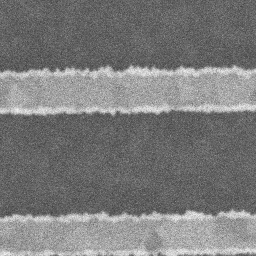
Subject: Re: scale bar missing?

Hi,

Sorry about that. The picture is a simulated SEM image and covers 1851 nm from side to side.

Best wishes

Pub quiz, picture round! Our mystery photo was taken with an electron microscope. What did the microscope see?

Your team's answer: one or a few lines or trenches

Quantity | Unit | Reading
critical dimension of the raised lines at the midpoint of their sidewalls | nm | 263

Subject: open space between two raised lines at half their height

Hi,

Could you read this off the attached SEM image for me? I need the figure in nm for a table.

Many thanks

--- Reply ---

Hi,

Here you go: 772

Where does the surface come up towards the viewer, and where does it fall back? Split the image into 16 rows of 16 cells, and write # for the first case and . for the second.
................
................
................
................
..#.#.#.##.####.
################
################
................
................
................
................
................
................
.............##.
################
################